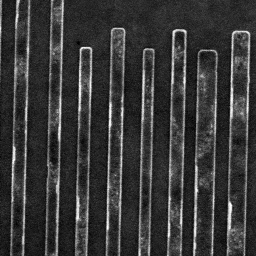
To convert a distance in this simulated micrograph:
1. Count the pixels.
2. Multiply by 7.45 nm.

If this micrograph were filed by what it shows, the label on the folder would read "parallel lines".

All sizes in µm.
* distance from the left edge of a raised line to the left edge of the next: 0.236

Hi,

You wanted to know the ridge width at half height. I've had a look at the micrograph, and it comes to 0.101 micrometres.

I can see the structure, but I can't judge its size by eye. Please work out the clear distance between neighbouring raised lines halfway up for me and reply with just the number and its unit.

135 nm